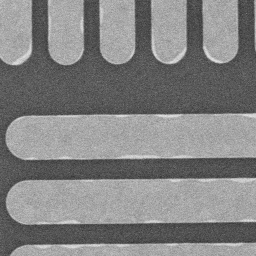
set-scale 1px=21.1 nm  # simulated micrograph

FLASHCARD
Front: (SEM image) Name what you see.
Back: groups of lines, slits or small figures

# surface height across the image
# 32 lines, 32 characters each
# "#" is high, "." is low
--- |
####..####...####..####..#####..
####..####...####..####..#####..
####..####...####..####..#####..
####..####...####..####..#####..
####..####...####..####..#####..
####..####...####..####...####..
####..####...####..####...####..
###....###...###....##.....##...
................................
................................
................................
................................
................................
................................
.........#######################
.###############################
.###############################
.###############################
.###############################
..##############################
................................
................................
....................#.###.####.#
..##############################
.###############################
.###############################
.###############################
..##############################
................................
................................
..................###.##########
..##############################